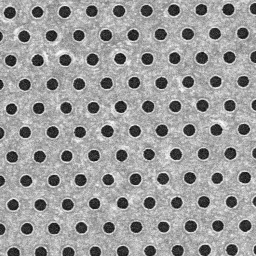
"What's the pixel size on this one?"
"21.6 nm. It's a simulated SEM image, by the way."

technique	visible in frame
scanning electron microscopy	a regular array of holes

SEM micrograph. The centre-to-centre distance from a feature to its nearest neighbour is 585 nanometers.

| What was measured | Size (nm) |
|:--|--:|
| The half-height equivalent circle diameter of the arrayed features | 273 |